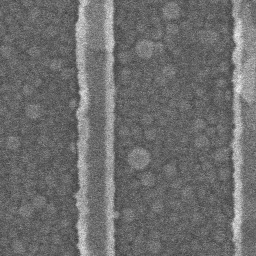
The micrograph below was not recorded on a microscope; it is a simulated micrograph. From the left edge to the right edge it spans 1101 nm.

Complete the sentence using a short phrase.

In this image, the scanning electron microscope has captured one or a few lines or trenches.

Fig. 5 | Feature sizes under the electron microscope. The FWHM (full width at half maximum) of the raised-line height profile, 128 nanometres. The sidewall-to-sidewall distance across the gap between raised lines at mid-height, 0.542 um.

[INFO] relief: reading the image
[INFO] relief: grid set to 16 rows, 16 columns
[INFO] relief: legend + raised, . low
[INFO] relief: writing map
.....++........+
.....++........+
.....++........+
.....++........+
.....++........+
.....++........+
.....++........+
.....++........+
.....++........+
.....++........+
.....++........+
.....++........+
.....++........+
.....++........+
.....++........+
.....++........+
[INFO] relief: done